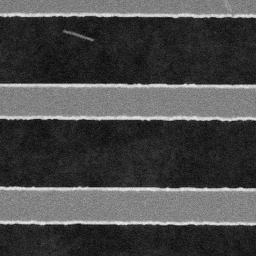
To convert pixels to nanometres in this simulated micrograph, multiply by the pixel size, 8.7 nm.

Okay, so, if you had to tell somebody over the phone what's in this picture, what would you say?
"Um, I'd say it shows lines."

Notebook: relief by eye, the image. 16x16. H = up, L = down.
HHHHHHHHHHHHHHHH
LLLLLLLLLLLLLLLL
LLLLLLLLLLLLLLLL
LLLLLLLLLLLLLLLL
LLLLLLLLLLLLLLLL
HHHHHHHHHHHHHHHH
HHHHHHHHHHHHHHHH
LLLLLLLLLLLLLHHL
LLLLLLLLLLLLLLLL
LLLLLLLLLLLLLLLL
LLLLLLLLLLLLLLLL
LLLLLLLLLLLLLLLL
HHHHHHHHHHHHHHHH
HHHHHHHHHHHHHHHH
LLLLLLLLLLLLLLLL
LLLLLLLLLLLLLLLL